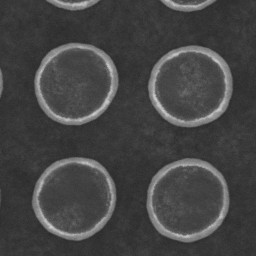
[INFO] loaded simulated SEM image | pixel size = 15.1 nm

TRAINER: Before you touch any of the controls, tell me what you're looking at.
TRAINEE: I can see raised bodies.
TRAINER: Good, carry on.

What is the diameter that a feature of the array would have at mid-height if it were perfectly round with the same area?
1170 nanometres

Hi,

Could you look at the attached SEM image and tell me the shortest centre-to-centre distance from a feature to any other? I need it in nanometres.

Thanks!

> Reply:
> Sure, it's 1710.